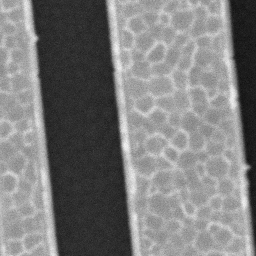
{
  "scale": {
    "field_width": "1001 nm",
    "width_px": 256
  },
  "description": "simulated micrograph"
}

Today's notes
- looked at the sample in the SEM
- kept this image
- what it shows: one or a few lines or trenches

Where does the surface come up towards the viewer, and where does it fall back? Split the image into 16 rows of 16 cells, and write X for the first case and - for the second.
XX-----XXXXXXX--
XX-----XXXXXXX--
XX-----XXXXXXX--
XX-----XXXXXXX--
XX-----XXXXXXXX-
XX-----XXXXXXXX-
XX-----XXXXXXXX-
XXX-----XXXXXXX-
XXX-----XXXXXXX-
XXX-----XXXXXXX-
XXX-----XXXXXXX-
XXX-----XXXXXXX-
XXX-----XXXXXXX-
XXX-----XXXXXXXX
XXX-----XXXXXXXX
XXX-----XXXXXXXX